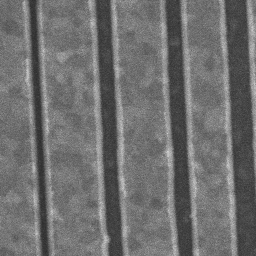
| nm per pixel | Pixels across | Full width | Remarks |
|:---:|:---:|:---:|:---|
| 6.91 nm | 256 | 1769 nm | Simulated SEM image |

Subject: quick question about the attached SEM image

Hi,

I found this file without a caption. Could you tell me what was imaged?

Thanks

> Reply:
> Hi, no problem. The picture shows one or a few lines or trenches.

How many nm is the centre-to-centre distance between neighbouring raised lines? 472